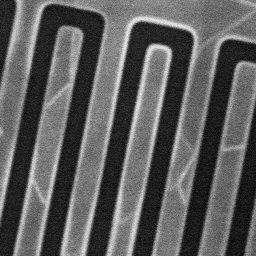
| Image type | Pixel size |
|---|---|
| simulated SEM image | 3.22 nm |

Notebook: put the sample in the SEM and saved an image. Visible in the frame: groups of lines, slits or small figures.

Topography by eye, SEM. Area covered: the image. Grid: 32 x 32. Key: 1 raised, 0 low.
00111100111111111111111111111111
00111000000011111111111111111111
00111000000001111001111111111111
00111000100001110000000111111111
00110001110001110000000011111111
01110001110001110000000011100000
01110001110001110001100011100000
01110001110011100011100011100000
01110011110011100011100011100011
11110011100011100011100011100111
11100011100011100011100111000111
11100011100011100011000111000111
11100011100111000111000111000111
11100111100111000111000111001111
11100111000111000111000111001110
11000111000111000111001111001110
11000111000111001110001110001110
11000111001110001110001110001110
11001111001110001110001110011110
10001110001110001110001110011100
10001110001110001110011110011100
10001110001110011100011100011100
10001110011100011100011100011100
10001100011100011100011100011100
00011100011100011100011100111000
00011100011100011100111100111000
00011100011100011000111000111000
00011100011000111000111000111001
00011000111000111000111000111001
00111000111000111000111001110001
00111000111000110001111001110001
00111000110000110001110001110001